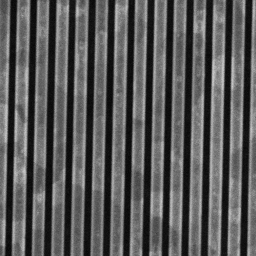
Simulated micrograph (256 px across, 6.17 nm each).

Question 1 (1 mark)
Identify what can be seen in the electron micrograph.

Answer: parallel lines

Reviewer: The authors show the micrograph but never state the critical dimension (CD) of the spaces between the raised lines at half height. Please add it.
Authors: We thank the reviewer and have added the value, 0.0532 micrometres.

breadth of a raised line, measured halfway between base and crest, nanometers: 64.8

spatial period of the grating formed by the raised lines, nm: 121